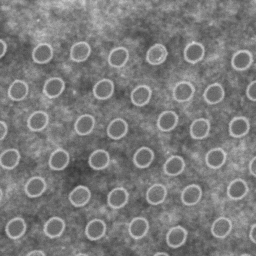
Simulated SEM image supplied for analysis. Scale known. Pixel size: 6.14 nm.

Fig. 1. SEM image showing a regular array of raised bodies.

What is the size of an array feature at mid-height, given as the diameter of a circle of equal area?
116 nanometers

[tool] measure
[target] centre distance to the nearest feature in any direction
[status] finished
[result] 0.221 µm